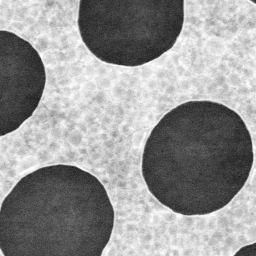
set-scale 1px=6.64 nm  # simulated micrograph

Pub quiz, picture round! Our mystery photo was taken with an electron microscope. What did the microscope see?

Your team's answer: holes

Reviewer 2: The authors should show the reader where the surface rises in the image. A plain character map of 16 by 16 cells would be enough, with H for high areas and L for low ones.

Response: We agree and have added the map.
HHHHHLLLLLLHHHHH
HHHHHLLLLLLHHHHH
LLHHHLLLLLLHHHHH
LLHHHHLLLLHHHHHH
LLLHHHHHHHHHHHHH
LLLHHHHHHHHHHHHH
LLHHHHHHHHHLLLHH
LLHHHHHHHHLLLLLH
HHHHHHHHHLLLLLLL
HHHHHHHHHLLLLLLL
HHHLLHHHHLLLLLLL
HLLLLLHHHLLLLLLH
LLLLLLLHHHLLLLHH
LLLLLLLHHHHHHHHH
LLLLLLLHHHHHHHHH
LLLLLLLHHHHHHHHL